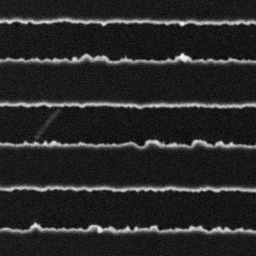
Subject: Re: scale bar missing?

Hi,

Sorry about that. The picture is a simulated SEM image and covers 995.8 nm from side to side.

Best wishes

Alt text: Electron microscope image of lines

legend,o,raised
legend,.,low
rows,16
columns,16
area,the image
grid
oooooooooooooooo
................
................
................
oooooooooooooooo
oooooooooooooooo
oooooooooooooooo
................
................
oooooooooooooooo
oooooooooooooooo
oooooooooooooooo
................
................
oooooooooooooooo
oooooooooooooooo